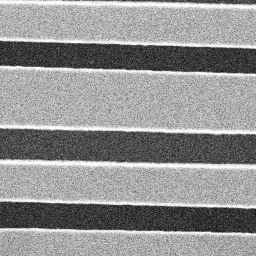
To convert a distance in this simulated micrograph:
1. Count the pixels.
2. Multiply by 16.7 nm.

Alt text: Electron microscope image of lines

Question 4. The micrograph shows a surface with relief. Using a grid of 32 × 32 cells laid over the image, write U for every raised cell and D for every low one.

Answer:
UUUUUUUUUUUUUUUDDDDDDDDDDDDDDDDD
UUUUUUUUUUUUUUUUUUUUUUUUUUUUUUUU
UUUUUUUUUUUUUUUUUUUUUUUUUUUUUUUU
UUUUUUUUUUUUUUUUUUUUUUUUUUUUUUUU
UUUUUUUUUUUUUUUUUUUUUUUUUUUUUUUU
DDDDDDDDDDDDDDDDUUUUUUUUUUUUUUUU
DDDDDDDDDDDDDDDDDDDDDDDDDDDDDDDD
DDDDDDDDDDDDDDDDDDDDDDDDDDDDDDDD
UUUUUDDDDDDDDDDDDDDDDDDDDDDDDDDD
UUUUUUUUUUUUUUUUUUUUUUUUUUUUUUUU
UUUUUUUUUUUUUUUUUUUUUUUUUUUUUUUU
UUUUUUUUUUUUUUUUUUUUUUUUUUUUUUUU
UUUUUUUUUUUUUUUUUUUUUUUUUUUUUUUU
UUUUUUUUUUUUUUUUUUUUUUUUUUUUUUUU
UUUUUUUUUUUUUUUUUUUUUUUUUUUUUUUU
UUUUUUUUUUUUUUUUUUUUUUUUUUUUUUUU
DDDDDDDDDDDDDDDDDDDDDDDDDDDUUUUU
DDDDDDDDDDDDDDDDDDDDDDDDDDDDDDDD
DDDDDDDDDDDDDDDDDDDDDDDDDDDDDDDD
DDDDDDDDDDDDDDDDDDDDDDDDDDDDDDDD
UUUUUUUUUUUUUUUDDDDDDDDDDDDDDDDD
UUUUUUUUUUUUUUUUUUUUUUUUUUUUUUUU
UUUUUUUUUUUUUUUUUUUUUUUUUUUUUUUU
UUUUUUUUUUUUUUUUUUUUUUUUUUUUUUUU
UUUUUUUUUUUUUUUUUUUUUUUUUUUUUUUU
DDDDDDDDDDDDDDUUUUUUUUUUUUUUUUUU
DDDDDDDDDDDDDDDDDDDDDDDDDDDDDDDD
DDDDDDDDDDDDDDDDDDDDDDDDDDDDDDDD
DDDDDDDDDDDDDDDDDDDDDDDDDDDDDDDD
UUUUUUUUUUUUUUUUUUUUUUUUUUUUUUUU
UUUUUUUUUUUUUUUUUUUUUUUUUUUUUUUU
UUUUUUUUUUUUUUUUUUUUUUUUUUUUUUUU